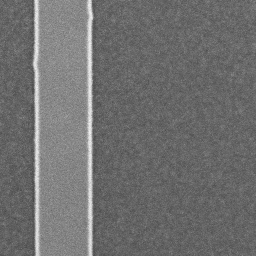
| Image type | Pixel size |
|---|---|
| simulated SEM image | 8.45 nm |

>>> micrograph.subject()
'one or a few lines or trenches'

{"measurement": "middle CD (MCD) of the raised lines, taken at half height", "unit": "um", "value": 0.452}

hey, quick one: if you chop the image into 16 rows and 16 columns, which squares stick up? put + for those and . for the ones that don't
..++++..........
..++++..........
..++++..........
..++++..........
..++++..........
..++++..........
..++++..........
..++++..........
..++++..........
..++++..........
..++++..........
..++++..........
..++++..........
..++++..........
..++++..........
..++++..........